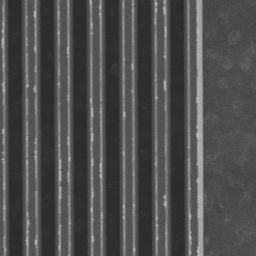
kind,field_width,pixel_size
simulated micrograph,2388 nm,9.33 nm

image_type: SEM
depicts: parallel lines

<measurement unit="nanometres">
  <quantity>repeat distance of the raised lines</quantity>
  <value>302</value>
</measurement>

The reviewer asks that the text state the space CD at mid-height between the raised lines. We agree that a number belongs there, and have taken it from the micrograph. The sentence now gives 174 nm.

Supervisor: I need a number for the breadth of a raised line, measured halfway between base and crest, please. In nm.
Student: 127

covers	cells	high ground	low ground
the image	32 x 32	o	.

o..oo..oo..oo..oo..oo..oo.......
o..oo..oo..oo..oo..oo..oo.......
o..oo..oo..oo..oo..oo..oo.......
o..oo..oo..oo..oo..oo..oo.......
o..oo..oo..oo..oo..oo..oo.......
o..oo..oo..oo..oo..oo..oo.......
o..oo..oo..oo..oo..oo..oo.......
o..oo..oo..oo..oo..oo..oo.......
o..oo..oo..oo..oo..oo..oo.......
o..oo..oo..oo..oo..oo..oo.......
o..oo..oo..oo..oo..oo..oo.......
o..oo..oo..oo..oo..oo..oo.......
o..oo..oo..oo..oo..oo..oo.......
o..oo..oo..oo..oo..oo..oo.......
o..oo..oo..oo..oo..oo..oo.......
o..oo..oo..oo..oo..oo..oo.......
o..oo..oo..oo..oo..oo..oo.......
o..oo..oo..oo..oo..oo..oo.......
o..oo..oo..oo..oo..oo..oo.......
o..oo..oo..oo..oo..oo..oo.......
o..oo..oo..oo..oo..oo..oo.......
o..oo..oo..oo..oo..oo..oo.......
o..oo..oo..oo..oo..oo..oo.......
o..oo..oo..oo..oo..oo..oo.......
o..oo..oo..oo..oo..oo..oo.......
o..oo..oo..oo..oo..oo..oo.......
o..oo..oo..oo..oo..oo..oo.......
o..oo..oo..oo..oo..oo..oo.......
o..oo..oo..oo..oo..oo..oo.......
o..oo..oo..oo..oo..oo...o.......
o..oo..oo..oo..oo..oo...o.......
o..oo..oo..oo..oo..oo...o.......